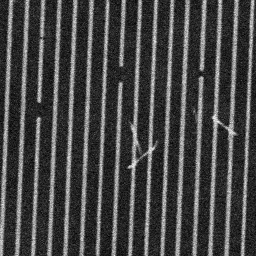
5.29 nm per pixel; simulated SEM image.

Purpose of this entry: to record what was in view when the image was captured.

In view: parallel lines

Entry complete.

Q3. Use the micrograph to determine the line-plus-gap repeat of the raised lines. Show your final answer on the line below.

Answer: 85.1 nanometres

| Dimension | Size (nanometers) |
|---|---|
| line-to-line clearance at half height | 68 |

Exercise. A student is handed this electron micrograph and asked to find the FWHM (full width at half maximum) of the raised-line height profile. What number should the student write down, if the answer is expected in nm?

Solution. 19.2